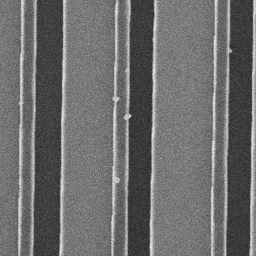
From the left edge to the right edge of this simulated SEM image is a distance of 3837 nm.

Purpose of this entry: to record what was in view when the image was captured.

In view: lines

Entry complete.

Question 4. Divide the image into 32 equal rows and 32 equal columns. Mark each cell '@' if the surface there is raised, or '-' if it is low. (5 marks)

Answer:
@@@@----@@@@@@@@---@@@@@@@@@@---
@@@@----@@@@@@@@---@@@@@@@@@@---
@@@@----@@@@@@@@---@@@@@@@@@@---
@@@@----@@@@@@@@---@@@@@@@@@@---
@@@@----@@@@@@@@---@@@@@@@@@@---
@@@@----@@@@@@@@---@@@@@@@@@@---
@@@@----@@@@@@@@---@@@@@@@@@@---
@@@@----@@@@@@@@---@@@@@@@@@@---
@@@@----@@@@@@@@---@@@@@@@@@@---
@@@@----@@@@@@@@---@@@@@@@@@@---
@@@@----@@@@@@@@---@@@@@@@@@----
@@@@----@@@@@@@@---@@@@@@@@@----
@@@@----@@@@@@@@---@@@@@@@@@----
@@@@----@@@@@@@@---@@@@@@@@@----
@@@@----@@@@@@@@---@@@@@@@@@----
@@@@----@@@@@@@@---@@@@@@@@@----
@@@@----@@@@@@@@---@@@@@@@@@----
@@@@----@@@@@@@@---@@@@@@@@@---@
@@@@----@@@@@@@@---@@@@@@@@@---@
@@@@----@@@@@@@@---@@@@@@@@@---@
@@@@----@@@@@@@@---@@@@@@@@@---@
@@@@----@@@@@@@@---@@@@@@@@@---@
@@@@----@@@@@@@@---@@@@@@@@@---@
@@@@----@@@@@@@@---@@@@@@@@@---@
@@@@----@@@@@@@@---@@@@@@@@@---@
@@@@----@@@@@@@@---@@@@@@@@@---@
@@@@----@@@@@@@@---@@@@@@@@@---@
@@@@----@@@@@@@@---@@@@@@@@@---@
@@@@----@@@@@@@@---@@@@@@@@@---@
@@@@----@@@@@@@@---@@@@@@@@@---@
@@@@----@@@@@@@@---@@@@@@@@@---@
@@@@----@@@@@@@@---@@@@@@@@@---@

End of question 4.